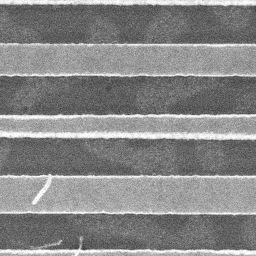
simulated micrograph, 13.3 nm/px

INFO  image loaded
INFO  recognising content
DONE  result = lines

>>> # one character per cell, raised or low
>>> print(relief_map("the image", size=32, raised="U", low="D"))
DDDDDDDDDDDDDDDDDDDDDDDUDDUUUDUU
DDDDDDDDDDDDDDDDDDDDDDDDDDDDDDDD
DDDDDDDDDDDDDDDDDDDDDDDDDDDDDDDD
DDDDDDDDDDDDDDDDDDDDDDDDDDDDDDDD
DDDDDDDDDDDDDDDDDDDDDDDDDDDDDDDD
DUUDUDDDDDUDDDDDDDDDDDDDDDDDDDDD
UUUUUUUUUUUUUUUUUUUUUUUUUUUUUUUU
UUUUUUUUUUUUUUUUUUUUUUUUUUUUUUUU
UUUUUUUUUUUUUUUUUUUUUUUUUUUUUUUU
DDDDDDDDDDDDDDDDDDDDDDDDDDDDDDDD
DDDDDDDDDDDDDDDDDDDDDDDDDDDDDDDD
DDDDDDDDDDDDDDDDDDDDDDDDDDDDDDDD
DDDDDDDDDDDDDDDDDDDDDDDDDDDDDDDD
DDDDDDDDDDDDDDDDDDDDDDDDDDDDDDDD
UUUUUUDUUUUUUUUUUUUUUUUUUUUUUUUU
UUUUUUUUUUUUUUUUUUUUUUUUUUUUUUUU
UUUUUUUUUUUUUUUUUUUUUUUUUUUUUUUU
DDDDDDDDDDDDDDDDDDDDDDDDDDDDDDDD
DDDDDDDDDDDDDDDDDDDDDDDDDDDDDDDD
DDDDDDDDDDDDDDDDDDDDDDDDDDDDDDDD
DDDDDDDDDDDDDDDDDDDDDDDDDDDDDDDD
DDDDDDDDDDDDDDDDDDDDDDDDDDDDDDDD
UUUUUUUUUUUUUUUUUUUUUUUUUUUUUUUU
UUUUUUUUUUUUUUUUUUUUUUUUUUUUUUUU
UUUUUUUUUUUUUUUUUUUUUUUUUUUUUUUU
UUUUUUUUUUUUUUUUUUUUUUUUUUUUUUUU
UUUUUUUUUUUUUUUUUUUUUUUUUUUUUUUU
DDDDDDDDDDDDDDDDDDDDDDDDDDDDDDDD
DDDDDDDDDDDDDDDDDDDDDDDDDDDDDDDD
DDDDDDDDDDDDDDDDDDDDDDDDDDDDDDDD
DDDDDDDDDDDDDDDDDDDDDDDDDDDDDDDD
UUUUUUUUUUUUUUUUUUUUUUUUUUUUUUUU